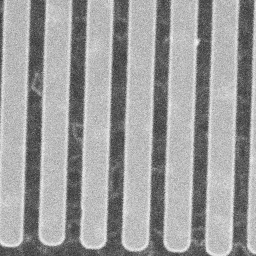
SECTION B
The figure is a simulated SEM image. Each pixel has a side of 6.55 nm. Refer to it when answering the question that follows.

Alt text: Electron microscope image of parallel lines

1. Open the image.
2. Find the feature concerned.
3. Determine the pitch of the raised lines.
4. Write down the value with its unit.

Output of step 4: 274 nm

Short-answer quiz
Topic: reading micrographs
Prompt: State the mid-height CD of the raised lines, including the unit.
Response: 168 nm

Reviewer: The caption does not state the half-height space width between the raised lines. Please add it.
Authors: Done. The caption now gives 106 nanometres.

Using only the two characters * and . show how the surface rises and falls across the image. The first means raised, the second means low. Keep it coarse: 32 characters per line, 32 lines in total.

.***..***..***..****.****..***..
.***..***..***..***..****..***..
.***..***..***..***..****..***..
****..***..***..***..****..***..
****..***..***..***..****..***..
****..***..***..***..****..***..
***...***..***..***..***..****..
***...***..***..***..***..****..
***...***..***..***..***..****..
***...***..***..***..***..****..
***..****..***..***..***..****..
***..****..***..***..***..****..
***..****..***..***..***..****..
***..****..***..***..***..***..*
***..***...***..***..***..***..*
***..***...***..***..***..***..*
***..***...***..***..***..***..*
***..***..****..***..***..***..*
***..***..****..***..***..******
***..***..****..***..***..****.*
***..***..****..***..***..***..*
***..***..****..***..***..***..*
***..***..*****.***..***..***..*
***..***..*****.***..***..***..*
***..***..***..****..***..***..*
***..***..***..****..***..***..*
***..***..***..****..***..***..*
***..***..***..****..***..***..*
***..***..***..****..***..***..*
***..***..***..****..***..***..*
**....*...***..***...***..***..*
..........................***.*.